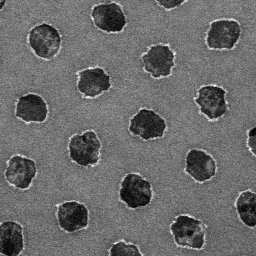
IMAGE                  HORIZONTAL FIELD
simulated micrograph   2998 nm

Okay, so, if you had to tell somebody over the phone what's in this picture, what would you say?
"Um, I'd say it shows a regular array of raised bodies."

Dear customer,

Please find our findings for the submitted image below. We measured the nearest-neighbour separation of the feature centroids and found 765 nm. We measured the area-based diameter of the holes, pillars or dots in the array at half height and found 0.381 µm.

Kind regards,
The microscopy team